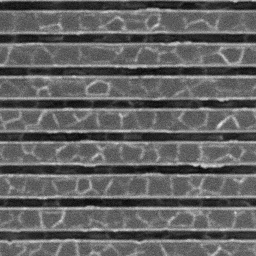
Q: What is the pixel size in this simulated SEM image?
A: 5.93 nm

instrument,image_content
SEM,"parallel lines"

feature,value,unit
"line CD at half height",136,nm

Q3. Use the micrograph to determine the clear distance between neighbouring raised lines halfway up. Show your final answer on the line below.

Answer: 62.2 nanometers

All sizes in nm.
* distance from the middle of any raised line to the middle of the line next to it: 195